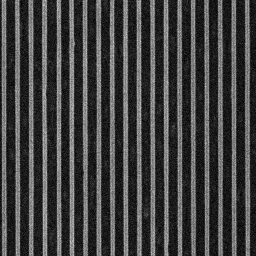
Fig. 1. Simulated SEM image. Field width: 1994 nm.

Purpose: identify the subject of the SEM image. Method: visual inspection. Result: parallel lines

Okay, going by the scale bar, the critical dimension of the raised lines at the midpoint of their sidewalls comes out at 30.2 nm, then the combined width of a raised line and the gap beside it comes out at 0.105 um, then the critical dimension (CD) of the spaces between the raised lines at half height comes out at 0.075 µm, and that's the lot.